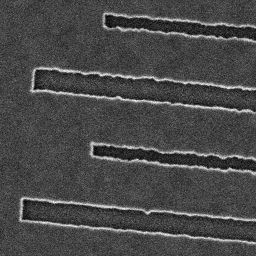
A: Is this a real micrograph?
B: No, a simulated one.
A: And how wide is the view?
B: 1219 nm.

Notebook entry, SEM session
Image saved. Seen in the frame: one or a few lines or trenches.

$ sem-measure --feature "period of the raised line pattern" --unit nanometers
310